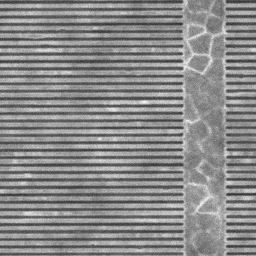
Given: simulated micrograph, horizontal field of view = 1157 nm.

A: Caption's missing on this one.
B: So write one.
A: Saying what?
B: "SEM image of parallel lines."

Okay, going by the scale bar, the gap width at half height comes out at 15.8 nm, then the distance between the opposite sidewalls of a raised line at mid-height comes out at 16.4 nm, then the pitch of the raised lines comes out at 0.0335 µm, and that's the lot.